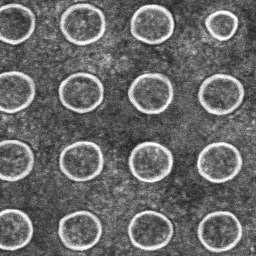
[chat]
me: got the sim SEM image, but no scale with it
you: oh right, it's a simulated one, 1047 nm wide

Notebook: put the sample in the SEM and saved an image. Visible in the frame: a regular array of raised bodies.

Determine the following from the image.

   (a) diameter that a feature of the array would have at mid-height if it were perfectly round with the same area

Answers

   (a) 0.162 microns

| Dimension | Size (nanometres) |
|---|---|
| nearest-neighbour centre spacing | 280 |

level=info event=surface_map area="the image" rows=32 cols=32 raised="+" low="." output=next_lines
................................
++++....++++.....++++...........
++++....+++++....++++.....++++..
++++....+++++....++++.....+++...
+++.....++++.....++++......++...
................................
................................
................................
................................
+++......++.......++.......+....
++++....+++++....++++....+++++..
++++....+++++...+++++....+++++..
++++....+++++...+++++....+++++..
+++......++......++++.....+++...
................................
................................
................................
................................
+++.....++++.....+++......+++...
++++....+++++...+++++....+++++..
++++....+++++...+++++....+++++..
+++.....++++.....++++....++++...
..........+.......+.......++....
................................
................................
................................
.+................+.............
++++....++++.....++++.....++++..
++++....++++....+++++....+++++..
++++....++++....+++++....+++++..
+++.....++++.....+++......+++...
................................